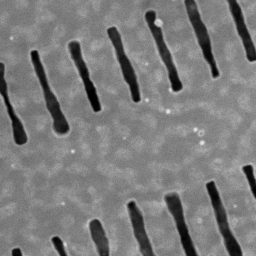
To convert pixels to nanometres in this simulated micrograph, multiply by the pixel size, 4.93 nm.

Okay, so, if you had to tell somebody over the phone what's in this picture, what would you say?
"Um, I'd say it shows holes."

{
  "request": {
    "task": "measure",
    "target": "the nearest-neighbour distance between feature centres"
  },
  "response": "203 nanometres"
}